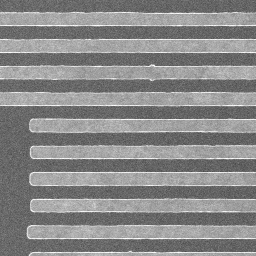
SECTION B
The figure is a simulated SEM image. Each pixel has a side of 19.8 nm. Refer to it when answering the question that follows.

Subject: parallel lines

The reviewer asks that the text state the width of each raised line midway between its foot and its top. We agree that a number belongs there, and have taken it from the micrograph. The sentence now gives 256 nm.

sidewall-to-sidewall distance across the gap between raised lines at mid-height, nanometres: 275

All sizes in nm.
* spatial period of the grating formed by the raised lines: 528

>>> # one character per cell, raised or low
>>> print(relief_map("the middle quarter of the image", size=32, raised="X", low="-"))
---------------------XX---------
XXXXXXXXXXXXXXXXXXXXXXXXXXXXXXXX
XXXXXXXXXXXXXXXXXXXXXXXXXXXXXXXX
XXXXXXXXXXXXXXXXXXXXXXXXXXXXXXXX
--------------------------------
--------------------------------
--------------------------------
XXXXXXXXXXXXXXXXXXXXXXXXXXXXXXXX
XXXXXXXXXXXXXXXXXXXXXXXXXXXXXXXX
XXXXXXXXXXXXXXXXXXXXXXXXXXXXXXXX
--------------------------------
--------------------------------
--------------------------------
--------------------------------
XXXXXXXXXXXXXXXXXXXXXXXXXXXXXXXX
XXXXXXXXXXXXXXXXXXXXXXXXXXXXXXXX
XXXXXXXXXXXXXXXXXXXXXXXXXXXXXXXX
--------------------------------
--------------------------------
--------------------------------
--------------------------------
XXXXXXXXXXXXXXXXXXXXXXXXXXXXXXXX
XXXXXXXXXXXXXXXXXXXXXXXXXXXXXXXX
XXXXXXXXXXXXXXXXXXXXXXXXXXXXXXXX
--------------------------------
--------------------------------
--------------------------------
XXXXXXXXXXXXXXXXXXXXXXXXXXXXXXXX
XXXXXXXXXXXXXXXXXXXXXXXXXXXXXXXX
XXXXXXXXXXXXXXXXXXXXXXXXXXXXXXXX
--------------------------------
--------------------------------